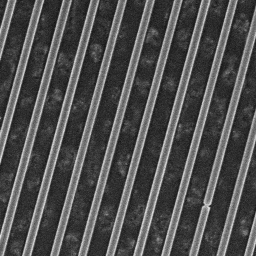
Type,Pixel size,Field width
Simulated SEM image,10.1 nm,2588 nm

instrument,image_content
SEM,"parallel lines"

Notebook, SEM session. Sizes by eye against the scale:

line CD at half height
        75.7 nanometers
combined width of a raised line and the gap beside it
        271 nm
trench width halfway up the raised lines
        0.199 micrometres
